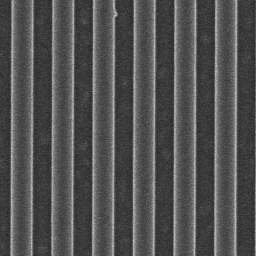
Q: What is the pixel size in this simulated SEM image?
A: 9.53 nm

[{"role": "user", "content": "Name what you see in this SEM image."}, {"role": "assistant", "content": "parallel lines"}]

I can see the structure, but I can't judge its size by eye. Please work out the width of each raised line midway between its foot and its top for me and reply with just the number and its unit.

198 nm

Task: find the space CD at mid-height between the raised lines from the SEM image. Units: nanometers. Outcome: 188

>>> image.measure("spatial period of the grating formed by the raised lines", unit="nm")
388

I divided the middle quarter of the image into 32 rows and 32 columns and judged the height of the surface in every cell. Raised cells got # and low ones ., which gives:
##.....#####......#####.....####
##.....#####......#####.....####
##.....#####......#####.....####
##.....#####......#####.....####
##.....#####......#####.....####
##.....#####......#####.....####
##.....#####......#####.....####
##.....#####......#####.....####
##.....#####......#####.....####
##.....#####......#####.....####
##.....#####......#####.....####
##.....#####......#####.....####
##.....#####......#####.....####
##.....#####......#####.....####
##.....#####......#####.....####
##.....#####......#####.....####
##.....#####......#####.....####
##.....#####......#####.....####
##.....#####......#####.....####
##.....#####......#####.....####
##.....#####......#####.....####
##.....#####......#####.....####
##.....#####......#####.....####
##.....#####......#####.....####
##.....#####......#####.....####
##.....#####......#####.....####
##.....#####......#####.....####
##.....#####......#####.....####
##.....#####......#####.....####
##.....#####......#####.....####
##.....#####......#####.....####
##.....#####......#####.....####